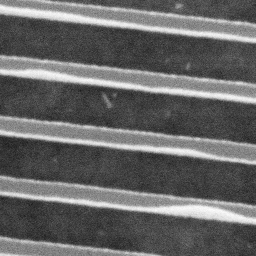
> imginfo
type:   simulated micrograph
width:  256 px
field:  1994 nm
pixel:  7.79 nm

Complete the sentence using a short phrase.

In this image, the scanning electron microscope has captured lines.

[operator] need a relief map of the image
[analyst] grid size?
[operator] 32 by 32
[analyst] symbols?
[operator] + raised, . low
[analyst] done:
+++++++++.......................
..+++++++++++++++++.............
..........+++++++++++++++++.....
.................+++++++++++++++
..........................++++++
................................
................................
+++++...........................
++++++++++++++..................
......++++++++++++++++..........
.............++++++++++++++++++.
.....................+++++++++++
..............................++
................................
................................
+++++++++.......................
++++++++++++++++++..............
.......+++++++++++++++++++......
................++++++++++++++++
.........................+++++++
................................
................................
++++............................
++++++++++++....................
..+++++++++++++++++++...........
...........++++++++++++++++++...
.........................+++++++
..............................++
................................
................................
+++++++.........................
+++++++++++++++.................